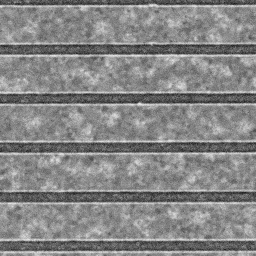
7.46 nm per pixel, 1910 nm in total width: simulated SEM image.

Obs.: parallel lines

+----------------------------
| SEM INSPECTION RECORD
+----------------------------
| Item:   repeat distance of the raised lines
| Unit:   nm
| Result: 367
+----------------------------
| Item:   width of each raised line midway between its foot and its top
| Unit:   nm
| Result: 280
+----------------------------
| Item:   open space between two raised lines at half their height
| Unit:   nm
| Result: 84.9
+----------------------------